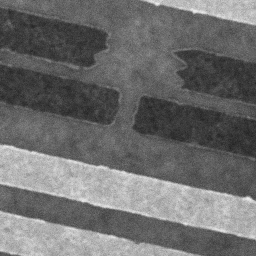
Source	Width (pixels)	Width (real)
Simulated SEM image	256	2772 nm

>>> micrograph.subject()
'one or a few lines or trenches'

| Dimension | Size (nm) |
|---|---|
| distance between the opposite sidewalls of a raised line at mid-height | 411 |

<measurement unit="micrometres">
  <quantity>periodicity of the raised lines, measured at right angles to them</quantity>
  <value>0.751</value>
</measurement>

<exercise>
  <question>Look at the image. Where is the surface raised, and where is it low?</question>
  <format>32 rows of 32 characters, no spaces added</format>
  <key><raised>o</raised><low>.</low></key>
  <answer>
...................ooooooooooooo
ooo.....................oooooooo
oooooooo.....................ooo
oooooooooooo....................
oooooooooooooo..................
ooooooooooooo...................
.oooooooooooo.........ooooo.....
......oooooo..........oooooooo..
ooo......oo............ooooooooo
oooooooo..............oooooooooo
oooooooooooo...........ooooooooo
ooooooooooooooo.........oooooooo
ooooooooooooooo..ooooo.......ooo
...oooooooooooo..ooooooooo......
.......oooooooo..oooooooooooooo.
............oo...ooooooooooooooo
.................ooooooooooooooo
.....................ooooooooooo
oo.......................ooooooo
oooooo........................oo
ooooooooooo.....................
oooooooooooooooo................
oooooooooooooooooooo............
...ooooooooooooooooooooo........
.......oooooooooooooooooooooo...
...........ooooooooooooooooooooo
................oooooooooooooooo
ooooo................ooooooooooo
ooooooooo.................oooooo
oooooooooooooo................oo
oooooooooooooooooo..............
.oooooooooooooooooooooo.........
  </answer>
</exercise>